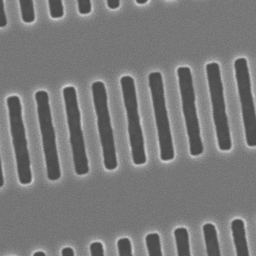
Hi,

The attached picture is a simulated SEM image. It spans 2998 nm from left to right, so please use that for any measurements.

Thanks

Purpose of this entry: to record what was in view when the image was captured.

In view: a regular array of holes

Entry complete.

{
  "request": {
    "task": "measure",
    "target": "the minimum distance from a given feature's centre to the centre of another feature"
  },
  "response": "335 nanometers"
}